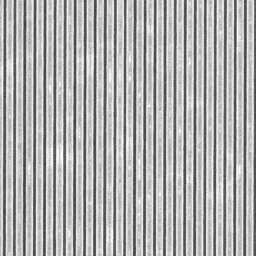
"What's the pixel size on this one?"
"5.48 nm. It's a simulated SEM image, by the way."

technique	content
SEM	parallel lines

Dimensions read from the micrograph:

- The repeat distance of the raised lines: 54.8 nanometers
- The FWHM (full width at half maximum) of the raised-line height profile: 34.9 nm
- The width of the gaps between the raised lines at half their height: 19.2 nanometres